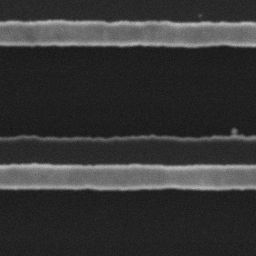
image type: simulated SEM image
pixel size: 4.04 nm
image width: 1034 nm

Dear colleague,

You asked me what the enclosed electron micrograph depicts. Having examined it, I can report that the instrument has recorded lines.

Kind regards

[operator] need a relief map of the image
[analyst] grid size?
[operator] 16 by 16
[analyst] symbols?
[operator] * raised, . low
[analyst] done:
****************
****************
****************
................
................
................
................
................
................
****************
****************
****************
................
................
................
................